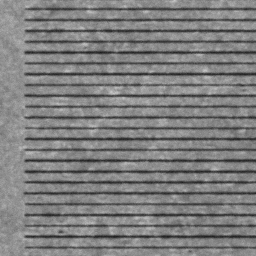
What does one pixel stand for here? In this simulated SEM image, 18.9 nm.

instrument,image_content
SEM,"parallel lines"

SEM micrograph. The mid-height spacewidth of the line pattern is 44.9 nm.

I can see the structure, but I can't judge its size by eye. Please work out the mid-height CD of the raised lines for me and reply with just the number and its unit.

0.166 µm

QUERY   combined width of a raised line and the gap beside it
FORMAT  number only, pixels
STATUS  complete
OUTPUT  10.8